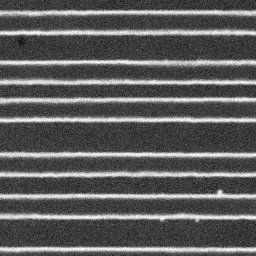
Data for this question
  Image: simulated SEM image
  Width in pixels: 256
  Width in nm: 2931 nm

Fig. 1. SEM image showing lines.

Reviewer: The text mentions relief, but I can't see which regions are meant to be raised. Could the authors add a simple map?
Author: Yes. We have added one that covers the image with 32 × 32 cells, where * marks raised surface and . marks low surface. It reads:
................................
................................
********************************
********************************
................................
................................
................................
................................
********************************
********************************
................................
................................
.******..***********************
********************************
********************************
................................
................................
................................
................................
********************************
********************************
********************************
................................
................................
................................
********************************
********************************
................................
................................
................................
................................
********************************